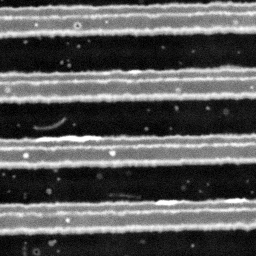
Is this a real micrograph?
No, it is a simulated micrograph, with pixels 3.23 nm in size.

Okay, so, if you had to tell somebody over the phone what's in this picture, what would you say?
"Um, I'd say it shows lines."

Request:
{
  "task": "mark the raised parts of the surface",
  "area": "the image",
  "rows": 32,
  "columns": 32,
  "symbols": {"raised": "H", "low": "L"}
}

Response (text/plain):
LLLLLLLLLLLLLLLLLLLLLLLLLLLLHLLL
HHHHHHHHHHHHHHHHHHHHHHHHHHHHHHHH
HHHHHHHHHHHHHHHHHHHHHHHHHHHHHHHH
HHHHHHHHHHHHHHHHHHHHHHHHHHHHHHHH
HLLLLLLLLLLLLLLLLLLLLLLLLLLLLLLL
LLLLLLLLLLLLLLLLLLLLLLLLLLLLLLLL
LLLLLLLLLLLLLLLLLLLLLLLLLLLLLLLL
LLLLLLLLLLLLLLLLLLLLLLLLLLLLLLLL
LLLLLLLLLLLLLLLLLLLLLLLLLLLLLLLL
HHHHHHHHHHHHHHHHHHHHHHHHHHHHHHHH
HHHHHHHHHHHHHHHHHHHHHHHHHHHHHHHH
HHHHHHHHHHHHHHHHHHHHHHHHHHHHHHHH
HHHHHHHHLLLLLLLLLLLLLLLLLLLLLLLL
LLLLLLLLLLLLLLLLLLLLLLLLLLLLLLLL
LLLLLLLLLLLLLLLLLLLLLLLLLLLLLLLL
LLLLLLLLLLLLLLLLLLLLLLLLLLLLLLLL
LLLLLLLLLLLLLLLLLLLLLLLLLLLLLLLL
LLLLHHHHHHHHHHHHHHHHHHHHHHHHHHHH
HHHHHHHHHHHHHHHHHHHHHHHHHHHHHHHH
HHHHHHHHHHHHHHHHHHHHHHHHHHHHHHHH
HHHHHHHHHHHHHHHHLHLLLLLLLLLLLLLL
LLLLLLLLLLLLLLLLLLLLLLLLLLLLLLLL
LLLLLLLLLLLLLLLLLLLLLLLLLLLLLLLL
LLLLLLLLLLLLLLLLLLLLLLLLLLLLLLLL
LLLLLLLLLLLLLLLLLLLLLLLLLLLLLLLL
LLLLLLLHHHHHHHHHHHHHHHHHHHHHHHHH
HHHHHHHHHHHHHHHHHHHHHHHHHHHHHHHH
HHHHHHHHHHHHHHHHHHHHHHHHHHHHHHHH
HHHHHHHHHHHHHHHHHHHHHHHLLLLLLLLL
LLLLLLLLLLLLLLLLLLLLLLLLLLLLLLLL
LLLLLLLLLLLLLLLLLLLLLLLLLLLLLLLL
LLLLLLLLLLLLLLLLLLLLLLLLLLLLLLLL